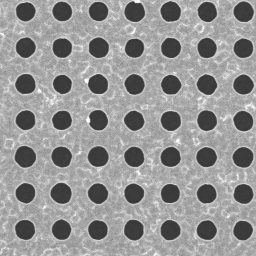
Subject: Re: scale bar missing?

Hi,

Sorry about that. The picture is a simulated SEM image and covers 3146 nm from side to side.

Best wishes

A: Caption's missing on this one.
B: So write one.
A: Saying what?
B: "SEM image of a regular array of holes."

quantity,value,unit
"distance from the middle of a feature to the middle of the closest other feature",443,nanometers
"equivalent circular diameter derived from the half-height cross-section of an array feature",243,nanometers